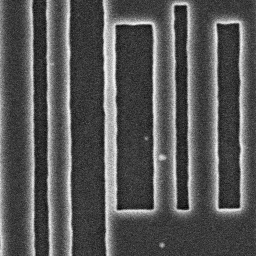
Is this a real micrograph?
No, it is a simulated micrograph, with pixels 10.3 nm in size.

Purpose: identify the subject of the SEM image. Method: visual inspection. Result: groups of lines, slits or small figures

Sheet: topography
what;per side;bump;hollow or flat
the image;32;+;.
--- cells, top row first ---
++++..+++....+++++++++++++++++++
++++..+++....+++++++++..++++++++
++++..+++....+++++++++..++++++++
++++..+++....+.....+++..+++...++
++++..++.....+.....+++..+++...++
++++..+++....+.....+++.++++...++
++++..+++....+.....+++.++++...++
++++..+++....+.....+++..+++...++
++++..+++....+.....+++..+++...++
++++..+++....+.....+++..+++...++
++++..+++....+.....+++..+++...++
++++..+++....+.....+++..+++...++
++++..+++....+.....+++..+++...++
++++..+++....+.....+++..+++...++
++++..+++....+.....+++..+++...++
++++..+++....++....+++..+++...++
++++..+++....++....+++..+++...++
++++..+++....+.....+++..+++...++
++++..+++....++....+++..+++...++
++++..+++....++....+++..+++...++
++++..+++....+.....+++..+++...++
++++..+++....+.....+++..+++...++
++++..+++....+.....+++..+++...++
++++..+++....++....+++..+++...++
++++..+++....+.....+++..+++...++
++++..+++....++....+++..+++...++
++++..+++....+++++++++++++++++++
++++..+++....+++++++++++++++++++
++++..+++....+++++++++++++++++++
++++..+++....+++++++++++++++++++
++++..+++....+++++++++++++++++++
++++..+++....+++++++++++++++++++